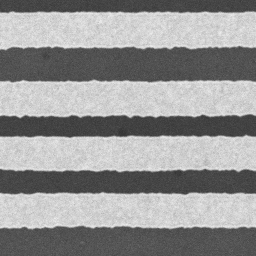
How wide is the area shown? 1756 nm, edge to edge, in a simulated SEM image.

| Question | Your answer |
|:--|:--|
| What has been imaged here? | lines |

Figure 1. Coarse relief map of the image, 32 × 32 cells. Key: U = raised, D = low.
DDDDDDDDDDDDDDDDDDDDDDDDDDDDDDDD
DDDDDDDDDDDDDDDDDDDDDDDDDDDDDDDD
UUUUUUUUUUUUUUUUUUUUUUUUUUUUUUUU
UUUUUUUUUUUUUUUUUUUUUUUUUUUUUUUU
UUUUUUUUUUUUUUUUUUUUUUUUUUUUUUUU
UUUUUUUUUUUUUUUUUUUUUUUUUUUUUUUU
DDDDDDDDDDDDDDDDDDDDDDDDDDDDDDDD
DDDDDDDDDDDDDDDDDDDDDDDDDDDDDDDD
DDDDDDDDDDDDDDDDDDDDDDDDDDDDDDDD
DDDDDDDDDDDDDDDDDDDDDDDDDDDDDDDD
UUUUUUUUUUUUUUUUUUUUUUUUUUUUUUUU
UUUUUUUUUUUUUUUUUUUUUUUUUUUUUUUU
UUUUUUUUUUUUUUUUUUUUUUUUUUUUUUUU
UUUUUUUUUUUUUUUUUUUUUUUUUUUUUUUU
DDUDUUDUUDDDUDDDUUDUUDDDUDUDDDDD
DDDDDDDDDDDDDDDDDDDDDDDDDDDDDDDD
DDDDDDDDDDDDDDDDDDDDDDDDDDDDDDDD
UUUUUUUUUUUUUUUUUUUUUUUUUUUUUUUU
UUUUUUUUUUUUUUUUUUUUUUUUUUUUUUUU
UUUUUUUUUUUUUUUUUUUUUUUUUUUUUUUU
UUUUUUUUUUUUUUUUUUUUUUUUUUUUUUUU
DDDDDDDDDDDDDDDDDDDDDDDDDDDDDDDD
DDDDDDDDDDDDDDDDDDDDDDDDDDDDDDDD
DDDDDDDDDDDDDDDDDDDDDDDDDDDDDDDD
UUUUUUUUUUUUUUUUUUUUUUUUUUUUUUUU
UUUUUUUUUUUUUUUUUUUUUUUUUUUUUUUU
UUUUUUUUUUUUUUUUUUUUUUUUUUUUUUUU
UUUUUUUUUUUUUUUUUUUUUUUUUUUUUUUU
DDDDDDDDDDDDDDDDDDDDDDDDDDDDDDDD
DDDDDDDDDDDDDDDDDDDDDDDDDDDDDDDD
DDDDDDDDDDDDDDDDDDDDDDDDDDDDDDDD
DDDDDDDDDDDDDDDDDDDDDDDDDDDDDDDD